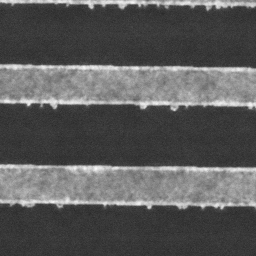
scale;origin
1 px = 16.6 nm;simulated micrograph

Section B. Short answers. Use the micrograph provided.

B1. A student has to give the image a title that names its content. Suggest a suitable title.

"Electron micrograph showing lines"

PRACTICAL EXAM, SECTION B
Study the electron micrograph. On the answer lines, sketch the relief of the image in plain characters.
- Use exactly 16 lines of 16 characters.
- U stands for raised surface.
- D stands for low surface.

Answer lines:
DDDDDDDDDDDDDDDD
DDDDDDDDDDDDDDDD
DDDDDDDDDDDDDDDD
DDDDDDDDDDDDDDDD
UUUUUUUUUUUUUUUU
UUUUUUUUUUUUUUUU
DDDDDDDDDDDDDUUU
DDDDDDDDDDDDDDDD
DDDDDDDDDDDDDDDD
DDDDDDDDDDDDDDDD
UUUUUUUDDDDDDDDD
UUUUUUUUUUUUUUUU
UUUUUUUUUUUUUUUU
DDDDDDDDDDDDDDDD
DDDDDDDDDDDDDDDD
DDDDDDDDDDDDDDDD